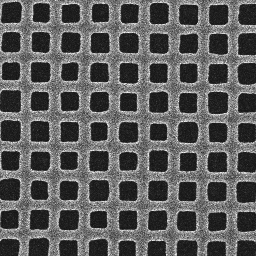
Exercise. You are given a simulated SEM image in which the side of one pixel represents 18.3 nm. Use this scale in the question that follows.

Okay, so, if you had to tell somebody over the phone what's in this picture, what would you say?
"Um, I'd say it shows a regular array of holes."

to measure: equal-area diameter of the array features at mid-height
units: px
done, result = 21.5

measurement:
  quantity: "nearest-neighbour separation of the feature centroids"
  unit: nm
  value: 535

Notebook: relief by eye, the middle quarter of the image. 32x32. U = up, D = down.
DDDDUUUDDDDUUUDDDDDUUDDDDDUUUDDD
DDDDUUDDDDDUUUDDDDDUUDDDDDUUUDDD
DDDDUUDDDDDUUUDDDDDUUDDDDDUUUDDD
DDDUUUDDDDDUUUDDDDDUUDDDDDUUUDDD
UUUUUUUDDDUUUUDDDDUUUUDDDDUUUDDD
UUUUUUUUUUUUUUUUUUUUUUUUUUUUUUUU
UUUUUUUUUUUUUUUUUUUUUUUUUUUUUUUU
DDDUUUUDDDDUUUDDDDUUUDDDDDUUUDDD
DDDDUUUDDDDUUUDDDDUUUDDDDDUUUDDD
DDDDUUDDDDDUUUDDDDUUUDDDDDUUUDDD
DDDDUUDDDDDUUUDDDDUUUDDDDDUUUDDD
DDDUUUUDDDDUUUDDDDUUUDDDDDUUUDDD
UUUUUUUUUUUUUUUUUUUUUUUUUUUUUUUU
UUUUUUUUUUUUUUUUUUUUUUUUUUUUUUUU
DDUUUUUUDDUUUUUDDDUUUUUUUUUUUUDD
DDDDUUUDDDDUUUDDDDDUUUDDDDUUUDDD
DDDDUUUDDDDUUUDDDDDUUDDDDDUUDDDD
DDDDUUUDDDDUUUDDDDDUUDDDDDUUDDDD
DDDDUUUDDDDUUUDDDDDUUDDDDDUUDDDD
UUUUUUUUUUUUUUDDDDUUUUUUUUUUUDDD
UUUUUUUUUUUUUUUUUUUUUUUUUUUUUUUU
UUUUUUUUUUUUUUUUUUUUUUUUUUUUUUUU
DDDDUUDDDDDUUUDDDDUUUDDDDDUUUDDD
DDDDUUDDDDDUUUDDDDDUUDDDDDUUUDDD
DDDDUUDDDDDUUUDDDDDUUDDDDDUUUDDD
DDDDUUDDDDDUUUDDDDUUUDDDDDUUUDDD
DDUUUUDDDDDUUUDDDDUUUDDDDDUUUDDD
UUUUUUUUUUUUUUUUUUUUUUUUUUUUUUUU
UUUUUUUUUUUUUUUUUUUUUUUUUUUUUUUU
DDDUUUDDDDDUUUDDDDUUUDDDDDUUUDDD
DDDDUUDDDDDUUUDDDDDUUDDDDDUUUDDD
DDDDUUDDDDDUUUDDDDDUUDDDDDUUUDDD